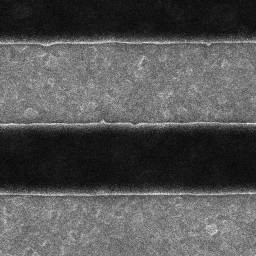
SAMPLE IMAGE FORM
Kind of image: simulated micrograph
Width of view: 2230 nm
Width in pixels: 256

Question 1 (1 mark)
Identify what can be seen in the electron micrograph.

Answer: one or a few lines or trenches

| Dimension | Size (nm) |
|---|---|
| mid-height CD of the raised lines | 622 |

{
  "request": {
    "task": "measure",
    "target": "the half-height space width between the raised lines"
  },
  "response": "701 nanometers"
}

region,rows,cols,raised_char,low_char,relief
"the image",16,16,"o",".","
oooooooooooooooo
oooooooooooooooo
oooooooooooooooo
................
................
................
................
................
oooooooooooooooo
oooooooooooooooo
oooooooooooooooo
oooooooooooooooo
................
................
................
................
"